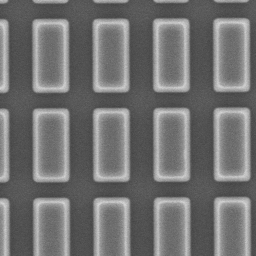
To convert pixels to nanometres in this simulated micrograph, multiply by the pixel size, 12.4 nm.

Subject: groups of lines, slits or small figures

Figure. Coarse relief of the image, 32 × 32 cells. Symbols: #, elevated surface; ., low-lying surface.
................................
................................
................................
#...####....####...####....####.
#...####....####...####....####.
#...####....####...####....####.
#...####....####...####....####.
#...####....####...####....####.
#...####....####...####....####.
#...####....####...####....####.
#...####....####...####....####.
................................
................................
................................
#...####....####....###....####.
#...####....####....###....####.
#...####....####....###....####.
#...####....####....###....####.
#...####....####....###....####.
#...####....####....###....####.
#...####....####....###....####.
#...####....####....###....####.
................................
................................
................................
#....###....####....###....####.
#...####....####....###....####.
#...####....####....###....####.
#...####....####....###....####.
#...####....####....###....####.
#...####....####....###....####.
#...####....####....###....####.